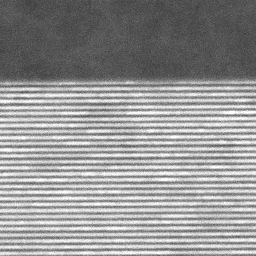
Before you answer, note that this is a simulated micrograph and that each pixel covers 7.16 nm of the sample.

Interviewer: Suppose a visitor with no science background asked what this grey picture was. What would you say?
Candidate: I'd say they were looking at parallel lines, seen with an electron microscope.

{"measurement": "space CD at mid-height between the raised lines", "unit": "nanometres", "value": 26.9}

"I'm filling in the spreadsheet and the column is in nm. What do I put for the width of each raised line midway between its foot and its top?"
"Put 19.7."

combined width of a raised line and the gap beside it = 43.5 nanometres